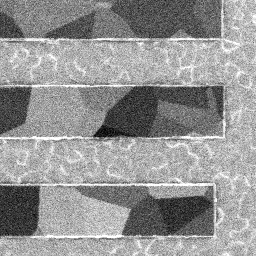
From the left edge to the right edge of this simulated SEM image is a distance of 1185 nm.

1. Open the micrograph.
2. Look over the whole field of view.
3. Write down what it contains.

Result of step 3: one or a few lines or trenches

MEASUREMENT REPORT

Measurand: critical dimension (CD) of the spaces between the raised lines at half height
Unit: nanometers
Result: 209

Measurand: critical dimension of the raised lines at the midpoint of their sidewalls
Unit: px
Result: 52.9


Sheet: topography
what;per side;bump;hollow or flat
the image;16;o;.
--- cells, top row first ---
oooooooooooooo..
oooooooooooooo..
ooooo...........
................
................
oooooooooooooo..
oooooooooooooo..
oooooooooooooo..
oooooooooooooo..
................
................
...........oo...
oooooooooooooo..
ooooooooooooo...
ooooooooooooo...
................